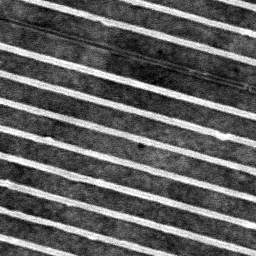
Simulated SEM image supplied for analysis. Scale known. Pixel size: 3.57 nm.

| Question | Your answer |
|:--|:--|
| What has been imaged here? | parallel lines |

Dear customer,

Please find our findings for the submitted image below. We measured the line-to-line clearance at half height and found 76.1 nm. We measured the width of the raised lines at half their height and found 15.9 nm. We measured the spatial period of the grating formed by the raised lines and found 26.3 pixels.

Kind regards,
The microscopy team